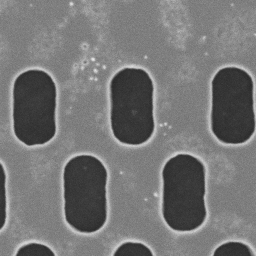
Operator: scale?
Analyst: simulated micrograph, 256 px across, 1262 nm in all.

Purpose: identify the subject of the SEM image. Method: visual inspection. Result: holes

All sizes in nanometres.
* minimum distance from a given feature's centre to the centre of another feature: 487